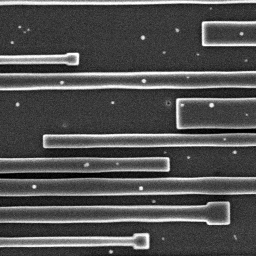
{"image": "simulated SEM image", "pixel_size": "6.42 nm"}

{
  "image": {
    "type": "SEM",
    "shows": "groups of lines, slits or small figures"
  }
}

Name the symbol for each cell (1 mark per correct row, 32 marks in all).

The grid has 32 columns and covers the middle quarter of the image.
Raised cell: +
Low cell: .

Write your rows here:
................................
................................
..................++++++++++++++
++++++++++++++++++++++++++++++++
++++++++++++++++++++++++++++++++
++++++++++++++++++++++++++++++++
................................
................................
................................
............................++++
............................++++
............................++++
............................++++
............................++++
............................++++
............................++++
................................
................................
++++++++++++++++++++++++++++++++
++++++++++++++++++++++++++++++++
++++++++++++++++++++++..........
................................
................................
................................
++++++++++++++++++++++++++......
++++++++++++++++++++++++++......
++++++++++++++++++++++++++......
................................
................................
++++++++++++++++++++++++++++++++
++++++++++++++++++++++++++++++++
++++++++++++++++++++++++++++++++